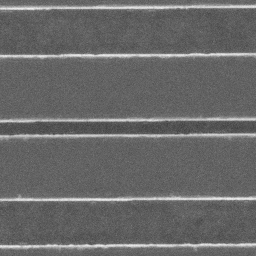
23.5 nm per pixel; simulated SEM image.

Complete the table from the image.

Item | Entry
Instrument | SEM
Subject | lines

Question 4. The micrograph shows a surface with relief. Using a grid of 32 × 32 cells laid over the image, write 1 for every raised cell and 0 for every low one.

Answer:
11111111111111111111111111111111
00000000000000000000000000000000
00000000000000000000000000000000
00000000000000000000000000000000
00000000000000000000000000000000
00000000000000000000000000000000
00000000000000000000000000000000
11111111111111111111111111111111
11111111111111111111111111111111
11111111111111111111111111111111
11111111111111111111111111111111
11111111111111111111111111111111
11111111111111111111111111111111
11111111111111111111111111111111
11111111111111111111111111111111
00000000000000000000000000000000
00000000000000000000000000000000
11111111111111111111111111111111
11111111111111111111111111111111
11111111111111111111111111111111
11111111111111111111111111111111
11111111111111111111111111111111
11111111111111111111111111111111
11111111111111111111111111111111
11111111111111111111111111111111
00000000000000000000000000000000
00000000000000000000000000000000
00000000000000000000000000000000
00000000000000000000000000000000
00000000000000000000000000000000
00000000000000000000000000000000
11111111111111111111111111111111